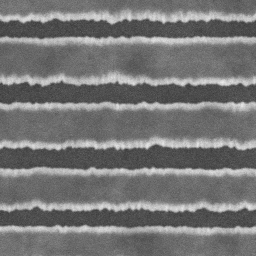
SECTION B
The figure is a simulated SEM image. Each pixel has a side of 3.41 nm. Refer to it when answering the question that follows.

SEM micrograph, lines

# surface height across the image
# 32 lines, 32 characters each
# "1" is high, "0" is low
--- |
11111111111111111111111111111111
11111111111111111111111111111111
10000100000000100000110000000001
00000000000000000000000000000000
00000000000000000000000000000000
11111111111111111111111111111111
11111111111111111111111111111111
11111111111111111111111111111111
11111111111111111111111111111111
11111111111111111111111111111111
00000100000000000001001010001000
00000000000000000000000000000000
00000000000000000000000000000000
11111111111111111111111111111111
11111111111111111111111111111111
11111111111111111111111111111111
11111111111111111111111111111111
11111111111111111111111111111111
00000001000000000000000000000000
00000000000000000000000000000000
00000000000000000000000000000000
11111111111111111111111111111111
11111111111111111111111111111111
11111111111111111111111111111111
11111111111111111111111111111111
11111111111111111111111111111111
00000000000000000000000000000000
00000000000000000000000000000000
11111111111111100011101100000100
11111111111111111111111111111111
11111111111111111111111111111111
11111111111111111111111111111111